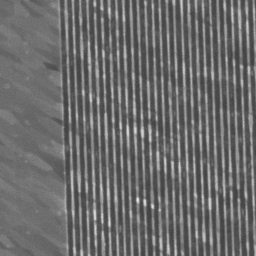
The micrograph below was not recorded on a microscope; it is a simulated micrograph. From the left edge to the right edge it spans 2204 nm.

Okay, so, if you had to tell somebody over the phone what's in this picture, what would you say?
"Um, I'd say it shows parallel lines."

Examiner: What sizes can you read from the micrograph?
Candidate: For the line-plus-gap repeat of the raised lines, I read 62.1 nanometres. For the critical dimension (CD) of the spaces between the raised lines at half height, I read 48.4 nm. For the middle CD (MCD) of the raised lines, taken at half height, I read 16.1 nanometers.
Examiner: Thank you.